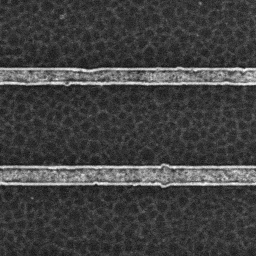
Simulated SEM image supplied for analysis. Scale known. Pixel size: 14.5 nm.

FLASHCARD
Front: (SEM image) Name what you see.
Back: one or a few lines or trenches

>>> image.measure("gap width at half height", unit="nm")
1200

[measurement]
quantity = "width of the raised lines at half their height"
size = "16.7 px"